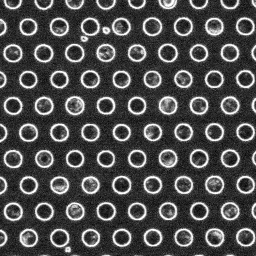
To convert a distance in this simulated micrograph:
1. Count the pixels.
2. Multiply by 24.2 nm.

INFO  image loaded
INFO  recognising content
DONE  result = a regular array of raised bodies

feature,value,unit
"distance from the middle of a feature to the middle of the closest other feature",736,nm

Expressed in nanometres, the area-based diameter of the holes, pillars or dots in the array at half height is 406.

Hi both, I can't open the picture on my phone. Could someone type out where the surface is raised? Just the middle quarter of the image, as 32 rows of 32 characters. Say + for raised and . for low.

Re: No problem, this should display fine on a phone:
................................
................................
.....+++.....+++.....++.....+++.
+...+++++....+++....++++....++++
+...+++++....+++....++++....++++
......++.....++......++......++.
................................
................................
..++..............+......++.....
.++++....+++....++++....++++....
.++++....++++...++++....++++....
.++++....+++.....+++....++++....
................................
................................
................................
.....+++.....++......++......++.
+....++++....+++....++++....++++
+....++++....+++....++++....++++
.....+++.....+++.....+++.....++.
................................
................................
................................
.+++.....+++.....+++....++++....
.++++....+++....++++....++++....
.++++....+++.....+++....++++....
..++......+......++......++.....
................................
................................
......+......++......++......++.
+....++++....+++....++++....++++
+....++++...++++....++++....++++
+....+++.....+++.....+++....+++.